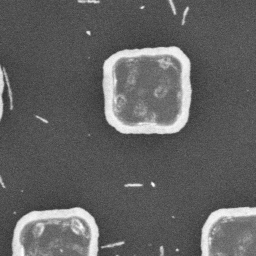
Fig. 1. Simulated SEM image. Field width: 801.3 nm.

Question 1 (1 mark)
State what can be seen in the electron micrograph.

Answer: raised bodies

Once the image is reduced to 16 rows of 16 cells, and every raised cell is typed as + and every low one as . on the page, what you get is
................
................
................
.......++++.....
.......+++++....
.......+++++....
.......+++++....
.......++++.....
................
................
................
................
................
..+++........+++
.+++++.......+++
.+++++.......+++